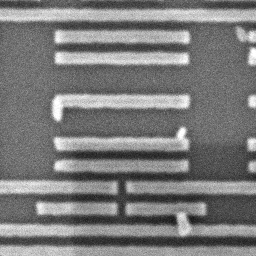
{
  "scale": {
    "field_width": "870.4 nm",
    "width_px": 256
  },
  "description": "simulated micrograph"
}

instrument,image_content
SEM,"wiring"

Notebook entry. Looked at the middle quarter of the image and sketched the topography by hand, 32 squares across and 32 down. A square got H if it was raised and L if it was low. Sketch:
LLLLLLLLLLLLLLLLLLLLLLLLLLLLLLLL
LLLLLLLLLLLLLLLLLLLLLLLLLLLLLLLL
LLLLLLLLLLLLLLLLLLLLLLLLLLLLLLLL
LLLLLLLLLLLLLLLLLLLLLLLLLLLLLLLL
LLLLLLLLLLLLLLLLLLLLLLLLLLLLLLLL
LLLLLLLLLLLLLLLLLLLLLLLLLLLLLLLL
LLLLLLLLLLLLLLLLLLLLLLLLLLLLLLLL
LLLLLLLLLLLLLLLLLLLLLLLLLLLLLLLL
HHHHHHHHHHHHHHHHHHHHHHHHHHHHHHHL
HHHHHHHHHHHHHHHHHHHHHHHHHHHHHHHL
HHHHHHHHHHHHHHHHHHHHHHHHHHHHHHHL
LLLLLLLLLLLLLLLLLLLLLLLLLLLLLLLL
LLLLLLLLLLLLLLLLLLLLLLLLLLLLLLLL
LLLLLLLLLLLLLLLLLLLLLLLLLLLLLLLL
LLLLLLLLLLLLLLLLLLLLLLLLLLLLLLLL
LLLLLLLLLLLLLLLLLLLLLLLLLLLLLLLL
LLLLLLLLLLLLLLLLLLLLLLLLLLLLLHLL
LLLLLLLLLLLLLLLLLLLLLLLLLLLLLHLL
LLLLLLLLLLLLLLLLLLLLLLLLLLLLHHLL
HHHHHHHHHHHHHHHHHHHHHHHHHHHHHHHL
HHHHHHHHHHHHHHHHHHHHHHHHHHHHHHHL
LLLLLLLLLLLLLLLLLLLLLLLLHHHHLLLL
LLLLLLLLLLLLLLLLLLLLLLLLLLLLLLLL
LLLLLLLLLLLLLLLLLLLLLLLLLLLLLLLL
HHHHHHHHHHHHHHHHHHHHHHHHHHHHHHHL
HHHHHHHHHHHHHHHHHHHHHHHHHHHHHHHL
HHHHHHHHHHHHHHHHHHHHHHHHHHHHHHHL
LLLLLLLLLLLLLLLLLLLLLLLLLLLLLLLL
LLLLLLLLLLLLLLLLLLLLLLLLLLLLLLLL
HHHHHHHHHHHHHLLLHHHHHHLHHLHHLHHH
HHHHHHHHHHHHHLLLHHHHHHHHHHHHHHHH
HHHHHHHHHHHHHLLLHHHHHHHHHHHHHHHH